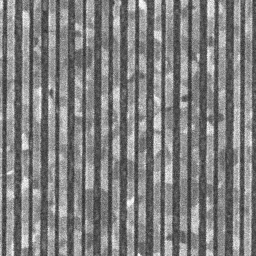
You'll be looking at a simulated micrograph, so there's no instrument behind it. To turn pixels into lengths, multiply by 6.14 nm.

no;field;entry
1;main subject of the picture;parallel lines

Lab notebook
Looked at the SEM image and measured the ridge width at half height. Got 40.7 nanometers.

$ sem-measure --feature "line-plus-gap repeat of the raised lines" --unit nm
81.2